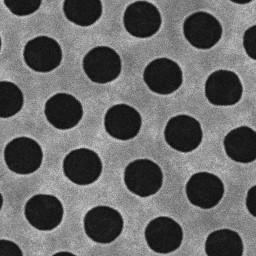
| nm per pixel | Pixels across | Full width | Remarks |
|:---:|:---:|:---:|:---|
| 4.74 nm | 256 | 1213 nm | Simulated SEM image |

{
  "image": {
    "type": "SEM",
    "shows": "a regular array of holes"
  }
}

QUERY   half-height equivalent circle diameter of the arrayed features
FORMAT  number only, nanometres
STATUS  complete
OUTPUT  179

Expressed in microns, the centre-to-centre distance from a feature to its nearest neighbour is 0.286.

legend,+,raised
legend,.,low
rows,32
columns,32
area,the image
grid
+....+++.....+++...+++++++++++.+
+...++++.....+++....++++++++++++
+++++++++...+++.....+++....+++++
++++++++++++++++....+++.....+++.
+++++++++++++++++..++++.....++..
+++....+++++++++++++++++...+++..
+++.....+++...+++++++++++++++++.
+++.....++.....++++..+++++++++++
++++...+++.....+++....++++++++++
+++++++++++....+++.....+++....++
..++++++++++++++++.....+++....++
...++++++++++++++++...++++....++
...+++....++++++++++++++++....++
...+++....++++...+++++++++++++++
.+++++....+++.....++++..++++++++
++++++....+++.....+++....+++++++
+++++++++++++....++++....++++...
++..+++++++++++++++++....+++....
+....+++++++++++++++++...+++....
+....+++....+++++++++++++++++...
+....+++.....+++...+++++++++++++
++..++++.....+++....+++++.++++++
+++++++++...++++....++++....++++
++++++++++++++++....+++.....+++.
++++...++++++++++..++++.....+++.
+++.....++++++++++++++++...++++.
+++.....+++....++++++++++++++++.
+++.....+++....++++...++++++++++
++++...++++....+++.....+++++++++
+++++++++++....+++.....+++....++
..++++++++++++++++.....+++....++
...++++++++++++++++..+++++....++